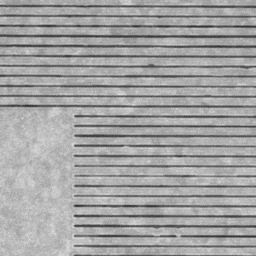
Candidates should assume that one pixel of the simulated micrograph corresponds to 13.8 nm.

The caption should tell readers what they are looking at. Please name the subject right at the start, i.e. parallel lines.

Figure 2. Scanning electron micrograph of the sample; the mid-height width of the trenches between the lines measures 2.87 pixels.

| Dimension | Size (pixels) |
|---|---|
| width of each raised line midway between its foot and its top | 7.5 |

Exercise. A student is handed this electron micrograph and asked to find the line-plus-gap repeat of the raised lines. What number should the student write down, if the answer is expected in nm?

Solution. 138